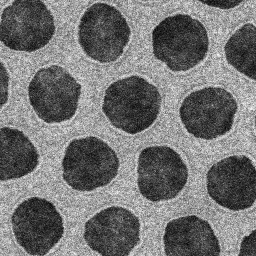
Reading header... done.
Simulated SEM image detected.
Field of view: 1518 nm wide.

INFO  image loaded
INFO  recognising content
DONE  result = holes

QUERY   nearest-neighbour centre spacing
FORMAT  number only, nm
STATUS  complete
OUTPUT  448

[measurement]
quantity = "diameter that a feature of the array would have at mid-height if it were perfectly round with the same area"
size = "341 nanometers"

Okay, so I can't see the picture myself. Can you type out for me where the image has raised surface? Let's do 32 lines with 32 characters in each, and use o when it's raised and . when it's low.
o.....oooooo..ooooooooooo.....oo
......oooo.....ooooooooooooooooo
.......ooo......oooo.....ooooooo
.......ooo......ooo.......oooo..
.......ooo......ooo.......ooo...
......oooo......ooo.......oo....
ooo.oooooo......ooo.......oo....
ooooooooooo....ooooo......oo....
.oooo...ooooooooooooo...ooooo...
.ooo.....ooooooo..ooooooooooooo.
.ooo......oooo.....ooooooooooooo
.oo.......ooo.......oooo.....ooo
.ooo......ooo.......ooo.......oo
oooo......ooo.......oo........oo
ooooo....oooo.......oo........oo
oooooo.ooooooo.....oooo......ooo
...oooooooooooo...ooooo......ooo
....ooooo....ooooooooooooo.ooooo
.....ooo......oooo....oooooooooo
.....ooo.......oo......oooooo..o
.....ooo.......oo......oooo.....
....oooo.......oo.......oo......
..oooooo......ooo......ooo......
ooooooooo....oooo......ooo......
oooooooooooooooooo....oooo......
oo.....oooooooooooooooooooo.....
oo.....ooooo.....ooooooooooooooo
o.......ooo......oooo.....oooooo
o.......ooo.......ooo......ooooo
oo......oo........oo.......ooo..
oo.....oooo......ooo.......ooo..
ooo...oooooo.....ooo........oo..